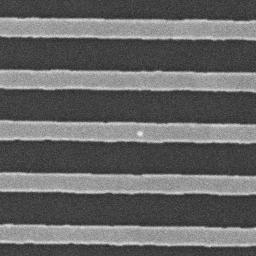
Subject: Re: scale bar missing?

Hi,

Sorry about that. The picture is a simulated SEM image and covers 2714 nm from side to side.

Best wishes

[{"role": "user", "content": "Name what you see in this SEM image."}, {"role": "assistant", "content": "lines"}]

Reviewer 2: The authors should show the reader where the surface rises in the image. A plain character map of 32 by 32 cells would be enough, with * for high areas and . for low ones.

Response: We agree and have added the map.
................................
................................
************....................
********************************
********************************
................................
................................
................................
................................
********************************
********************************
................................
................................
................................
................................
*******************..***........
********************************
...........*********************
................................
................................
................................
................................
********************************
********************************
................................
................................
................................
................................
***********************.*.......
********************************
.............*******************
................................